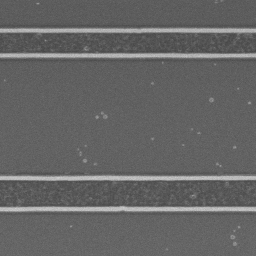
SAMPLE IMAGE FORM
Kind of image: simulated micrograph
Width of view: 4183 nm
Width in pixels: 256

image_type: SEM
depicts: one or a few lines or trenches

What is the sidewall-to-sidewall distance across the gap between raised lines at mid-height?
1990 nanometers